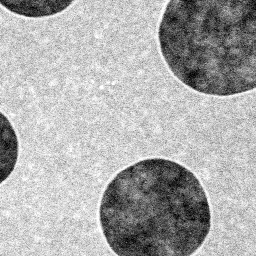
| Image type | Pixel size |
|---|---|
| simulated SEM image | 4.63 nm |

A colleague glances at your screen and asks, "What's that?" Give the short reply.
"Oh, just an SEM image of holes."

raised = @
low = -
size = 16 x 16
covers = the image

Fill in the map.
----@@@@@@------
@@@@@@@@@@------
@@@@@@@@@@------
@@@@@@@@@@------
@@@@@@@@@@@-----
@@@@@@@@@@@@----
@@@@@@@@@@@@@@@@
-@@@@@@@@@@@@@@@
-@@@@@@@@@@@@@@@
-@@@@@@@@@@@@@@@
-@@@@@@@----@@@@
@@@@@@@------@@@
@@@@@@-------@@@
@@@@@@-------@@@
@@@@@@-------@@@
@@@@@@@-----@@@@